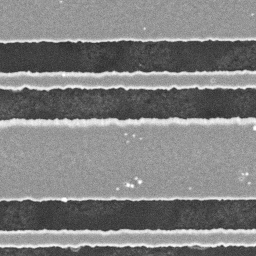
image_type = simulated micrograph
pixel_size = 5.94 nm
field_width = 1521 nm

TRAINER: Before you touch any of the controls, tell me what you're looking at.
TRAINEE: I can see lines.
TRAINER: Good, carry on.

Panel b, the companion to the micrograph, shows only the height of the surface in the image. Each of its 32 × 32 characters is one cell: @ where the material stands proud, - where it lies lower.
@@@@@@@@@@@@@@@@@@@@@@@@@@@@@@@@
@@@@@@@@@@@@@@@@@@@@@@@@@@@@@@@@
@@@@@@@@@@@@@@@@@@@@@@@@@@@@@@@@
@@@@@@@@@@@@@@@@@@@@@@@@@@@@@@@@
@@@@@@@@@@@@@@@@@@@@@@@@@@@@@@@@
--------------------------------
--------------------------------
--------------------------------
--------------------------------
@@@@@@@@@@@@@@@@@@@@@@@@@@@@@@@@
@@@@@@@@@@@@@@@@@@@@@@@@@@@@@@@@
--------------------------------
--------------------------------
--------------------------------
--------------------------------
@@@@@@@@@@@@@@@@@@@@@@@@@@@@@@@@
@@@@@@@@@@@@@@@@@@@@@@@@@@@@@@@@
@@@@@@@@@@@@@@@@@@@@@@@@@@@@@@@@
@@@@@@@@@@@@@@@@@@@@@@@@@@@@@@@@
@@@@@@@@@@@@@@@@@@@@@@@@@@@@@@@@
@@@@@@@@@@@@@@@@@@@@@@@@@@@@@@@@
@@@@@@@@@@@@@@@@@@@@@@@@@@@@@@@@
@@@@@@@@@@@@@@@@@@@@@@@@@@@@@@@@
@@@@@@@@@@@@@@@@@@@@@@@@@@@@@@@@
@@@@@@@@@@@@@@@@@@@@@@@@@@@@@@@@
--------------------------------
--------------------------------
--------------------------------
--------------------------------
@@@@@@@@@@@@@@@@@@@@@@@@@@@@@@@@
@@@@@@@@@@@@@@@@@@@@@@@@@@@@@@@@
--------------------------------